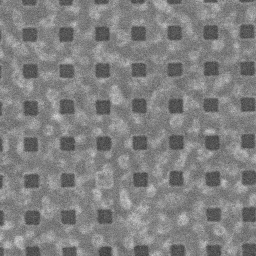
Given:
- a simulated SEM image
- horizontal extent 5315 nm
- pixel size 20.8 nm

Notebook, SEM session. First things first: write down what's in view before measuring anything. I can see a regular array of holes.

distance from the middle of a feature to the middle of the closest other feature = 747 nm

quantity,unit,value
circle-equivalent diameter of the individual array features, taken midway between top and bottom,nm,358